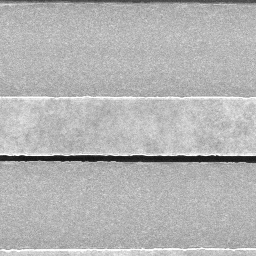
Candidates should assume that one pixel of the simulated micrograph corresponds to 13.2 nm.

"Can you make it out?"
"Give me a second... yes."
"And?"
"lines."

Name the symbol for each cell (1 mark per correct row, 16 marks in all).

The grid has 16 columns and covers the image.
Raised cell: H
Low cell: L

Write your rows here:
LLLLLLLLLLLLLLLL
LLLLLLLLLLLLLLLL
LLLLLLLLLLLLLLLL
LLLLLLLLLLLLLLLL
LLLLLLLLLLLLLLLL
LLLLLLLLLLLLLLLL
HHHHHHHHHHHHHHHH
HHHHHHHHHHHHHHHH
HHHHHHHHHHHHHHHH
HHHHHHHHHHHHHHHH
LLLLLLLLLLLLLLLL
LLLLLLLLLLLLLLLL
LLLLLLLLLLLLLLLL
LLLLLLLLLLLLLLLL
LLLLLLLLLLLLLLLL
LLLLLLLLLLLLLLLL